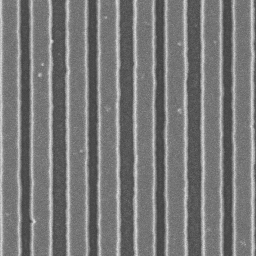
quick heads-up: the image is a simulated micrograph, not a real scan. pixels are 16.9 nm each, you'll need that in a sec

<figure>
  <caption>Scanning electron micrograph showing parallel lines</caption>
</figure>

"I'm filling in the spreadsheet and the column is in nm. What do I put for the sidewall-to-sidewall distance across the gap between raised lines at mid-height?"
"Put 194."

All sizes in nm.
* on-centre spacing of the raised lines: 568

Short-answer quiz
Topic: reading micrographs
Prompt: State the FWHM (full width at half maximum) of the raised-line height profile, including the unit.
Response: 340 nm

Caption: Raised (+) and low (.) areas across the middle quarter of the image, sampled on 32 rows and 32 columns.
.+++++...+++++....+++++..++++++.
.+++++...+++++....++++...++++++.
.+++++...++++.....+++++..++++++.
.+++++...++++.....+++++..++++++.
.+++++...+++++....+++++..+++++..
.+++++...++++.....+++++...++++..
.+++++...+++++....+++++...++++..
.+++++...+++++....++++...+++++..
.+++++...+++++....++++...+++++..
.+++++...+++++....++++....++++..
.+++++...++++.....++++...+++++..
.+++++...+++++....++++...+++++..
.+++++...++++.....++++....++++..
.+++++...++++.....++++....+++++.
.+++++...++++.....++++....+++++.
.+++++...+++++....++++...++++++.
.+++++...+++++....++++...+++++..
.+++++...+++++....++++...+++++..
.+++++...+++++....++++...+++++..
.+++++...++++.....++++...++++++.
.+++++...++++.....++++....+++++.
.+++++...++++.....+++++...++++..
.+++++...++++.....+++++..+++++..
.+++++...+++++....+++++..+++++..
.+++++...+++++....+++++..+++++..
.+++++...+++++....+++++..+++++..
.+++++...++++.....+++++..+++++..
.+++++...++++.....+++++...++++..
.+++++...+++++....+++++...++++..
.+++++...+++++....+++++..++++++.
.+++++..++++++....+++++..++++++.
.+++++...+++++....+++++..+++++..